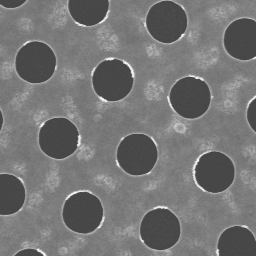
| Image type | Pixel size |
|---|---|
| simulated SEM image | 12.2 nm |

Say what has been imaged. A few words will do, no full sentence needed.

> a regular array of holes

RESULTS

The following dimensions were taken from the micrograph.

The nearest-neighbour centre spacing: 954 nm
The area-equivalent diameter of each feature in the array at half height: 502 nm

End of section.